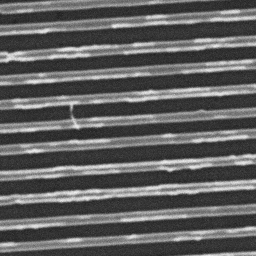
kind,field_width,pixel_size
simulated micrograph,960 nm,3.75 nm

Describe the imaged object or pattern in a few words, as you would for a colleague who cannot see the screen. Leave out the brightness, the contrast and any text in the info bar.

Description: parallel lines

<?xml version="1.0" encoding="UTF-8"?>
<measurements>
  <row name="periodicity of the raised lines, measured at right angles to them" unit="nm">90.1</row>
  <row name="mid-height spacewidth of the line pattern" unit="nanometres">58.5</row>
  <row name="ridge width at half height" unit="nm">31.1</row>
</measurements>